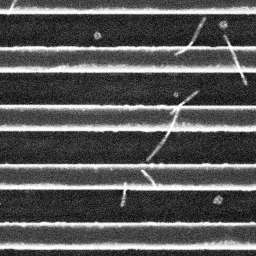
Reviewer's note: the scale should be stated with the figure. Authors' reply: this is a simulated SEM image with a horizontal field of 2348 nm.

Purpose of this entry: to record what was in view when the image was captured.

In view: lines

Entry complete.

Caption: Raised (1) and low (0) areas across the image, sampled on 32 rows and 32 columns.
11111111111111111111111111111111
11111111111111111111111111111111
00000000000000000000000000000000
00000000000000000000000000000000
00000000000000000000000000000000
00000000000000000000000000000000
11111111111111111111111111111111
11111111111111111111111111111111
11111111111111111111111111111111
00000000000000000000000000000000
00000000000000000000000000000000
00000000000000000000000000000000
00000000000000000000000000000000
11111111111111111111111111111111
11111111111111111111111111111111
11111111111111111111111111111111
00000000000000000000000000000000
00000000000000000000000000000000
00000000000000000000000000000000
00000000000000000000000000000000
00000000000000000000000000000000
11111111111111111111111111111111
11111111111111111111111111111111
00000000111111010111111111111111
00000000000000000000000000000000
00000000000000000000000000000000
00000000000000000000000000000000
00000000000000000000000000000000
11111111111111111111111111111111
11111111111111111111111111111111
11111111111111111111111111111111
00000000000000000000000000000000